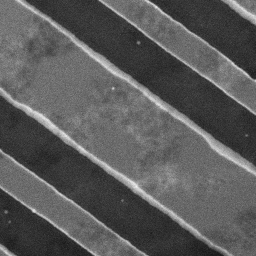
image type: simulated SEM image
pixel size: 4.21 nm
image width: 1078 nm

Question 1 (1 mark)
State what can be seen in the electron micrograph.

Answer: lines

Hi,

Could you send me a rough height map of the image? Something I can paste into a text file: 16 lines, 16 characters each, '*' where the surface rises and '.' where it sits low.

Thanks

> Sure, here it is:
**.....***.....*
****....***.....
*****....****...
******.....***..
*******.....***.
*********.....**
.*********.....*
...*********....
....*********...
.....*********..
**.....*********
***.....********
.***.....*******
..****.....*****
....***.....****
.....****....***